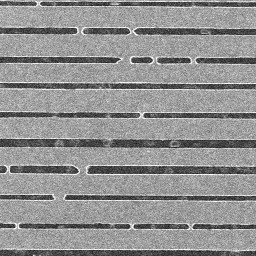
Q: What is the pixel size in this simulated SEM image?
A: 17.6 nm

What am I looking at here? parallel lines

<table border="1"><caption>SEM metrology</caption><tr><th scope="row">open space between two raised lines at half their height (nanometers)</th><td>112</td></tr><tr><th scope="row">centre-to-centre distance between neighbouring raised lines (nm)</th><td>489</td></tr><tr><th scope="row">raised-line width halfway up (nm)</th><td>367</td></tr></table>